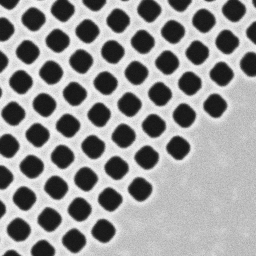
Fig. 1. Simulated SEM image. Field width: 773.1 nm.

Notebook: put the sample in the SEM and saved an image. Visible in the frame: a regular array of holes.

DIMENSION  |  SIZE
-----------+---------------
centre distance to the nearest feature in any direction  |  95.2 nanometers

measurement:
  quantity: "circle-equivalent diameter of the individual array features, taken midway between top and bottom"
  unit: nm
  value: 66.1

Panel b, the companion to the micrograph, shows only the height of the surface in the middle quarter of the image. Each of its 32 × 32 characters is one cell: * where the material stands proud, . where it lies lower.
**.....*********....***......***
***...*********......***....****
*********...***......****.****..
********.....***....*********...
********.....****..**********...
*...****.....*********...****...
.....****....*********....****..
......****.****..****......****.
.....*********....***......*****
*...**********.....***....******
*******...****.....**********..*
******.....***.....*********....
******......***...*********.....
...***.....**********...***.....
....***....*********.....***....
....****..****..***......****..*
....*********....***.....*******
...*********......***...********
******..****......*********...**
*****.....***....*********.....*
****......****..****.*****.....*
.****.....*********...****.....*
..***....*********......**.....*
..*****.****..****......****..**
..*********....***.....*********
.*********......***...**********
****...***......****************
***.....***....*****************
***.....****..****.*************
***.....*********....***********
.**....*********......**********
.****.****..****......**********